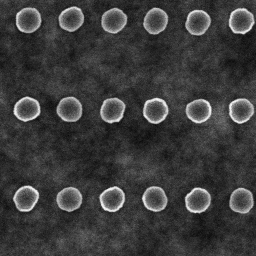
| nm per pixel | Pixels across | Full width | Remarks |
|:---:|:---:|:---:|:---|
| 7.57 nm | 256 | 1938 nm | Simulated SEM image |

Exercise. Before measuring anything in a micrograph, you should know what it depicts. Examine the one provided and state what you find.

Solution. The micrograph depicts a regular array of raised bodies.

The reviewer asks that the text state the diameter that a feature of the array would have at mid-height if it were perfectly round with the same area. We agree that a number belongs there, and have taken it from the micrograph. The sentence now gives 187 nm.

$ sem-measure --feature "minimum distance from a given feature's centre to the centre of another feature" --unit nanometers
323